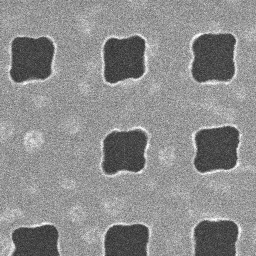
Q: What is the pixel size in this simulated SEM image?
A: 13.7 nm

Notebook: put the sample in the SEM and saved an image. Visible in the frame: holes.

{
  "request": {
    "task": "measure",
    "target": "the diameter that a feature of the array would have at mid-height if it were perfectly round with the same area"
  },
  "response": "635 nanometres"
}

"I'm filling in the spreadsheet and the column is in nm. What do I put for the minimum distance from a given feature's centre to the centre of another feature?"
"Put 1240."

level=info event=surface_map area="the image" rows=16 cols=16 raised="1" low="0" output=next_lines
1111111111111111
1111111111111111
1001111001110001
1001111001110001
1001111001110001
1111111111111111
1111111111111111
1111111111111111
1111111001110001
1111110001110001
1111110001110011
1111111111111111
1111111111111111
1111111111111111
1000111001110001
1000111001110001